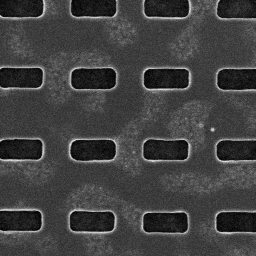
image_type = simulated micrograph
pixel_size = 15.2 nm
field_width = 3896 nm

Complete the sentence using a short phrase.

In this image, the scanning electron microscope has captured holes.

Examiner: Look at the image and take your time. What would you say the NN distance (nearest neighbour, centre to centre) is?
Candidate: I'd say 1080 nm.